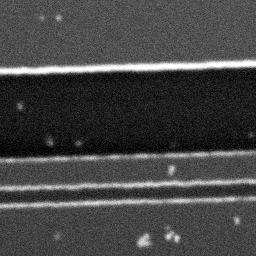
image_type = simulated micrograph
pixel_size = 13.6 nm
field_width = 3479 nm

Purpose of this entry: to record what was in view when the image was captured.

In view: lines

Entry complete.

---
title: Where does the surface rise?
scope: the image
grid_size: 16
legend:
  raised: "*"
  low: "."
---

****************
****************
****************
****************
................
................
................
................
................
................
****************
****************
****************
****************
****************
****************